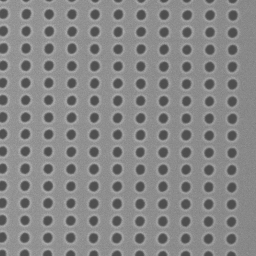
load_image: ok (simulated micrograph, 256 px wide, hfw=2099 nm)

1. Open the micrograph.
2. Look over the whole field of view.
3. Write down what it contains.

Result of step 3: a regular array of holes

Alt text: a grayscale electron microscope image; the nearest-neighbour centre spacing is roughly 140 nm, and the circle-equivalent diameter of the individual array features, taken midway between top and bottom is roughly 83.7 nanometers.